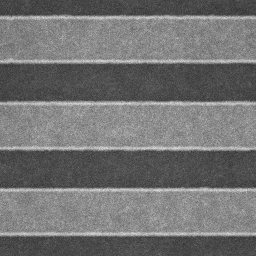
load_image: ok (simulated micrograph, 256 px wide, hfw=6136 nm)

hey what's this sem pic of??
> one or a few lines or trenches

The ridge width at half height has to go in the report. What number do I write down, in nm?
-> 1050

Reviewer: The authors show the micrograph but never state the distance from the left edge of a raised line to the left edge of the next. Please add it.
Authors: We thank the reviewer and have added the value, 2080 nm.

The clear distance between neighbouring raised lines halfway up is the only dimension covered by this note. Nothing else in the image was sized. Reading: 42.3 px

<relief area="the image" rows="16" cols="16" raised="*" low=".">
................
****************
****************
****************
................
................
...*............
****************
****************
................
................
................
****************
****************
****************
................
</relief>